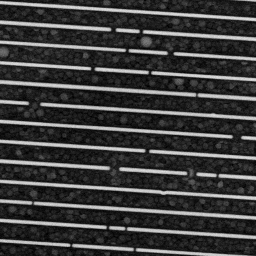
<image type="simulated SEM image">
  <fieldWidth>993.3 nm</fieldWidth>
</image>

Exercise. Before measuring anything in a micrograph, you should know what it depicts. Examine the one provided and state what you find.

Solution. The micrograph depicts parallel lines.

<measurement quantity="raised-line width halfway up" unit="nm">13.5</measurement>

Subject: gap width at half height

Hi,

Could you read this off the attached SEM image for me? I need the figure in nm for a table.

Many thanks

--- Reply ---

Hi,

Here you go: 64.2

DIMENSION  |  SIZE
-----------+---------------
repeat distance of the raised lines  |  76.7 nm